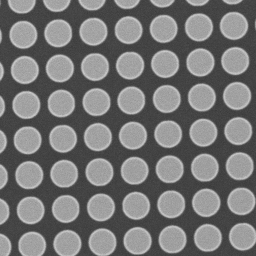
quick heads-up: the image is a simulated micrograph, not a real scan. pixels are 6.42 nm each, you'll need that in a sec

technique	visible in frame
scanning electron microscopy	an array of small figures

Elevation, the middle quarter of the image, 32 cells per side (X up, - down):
XX--XXXXXXX--XXXXXXX--XXXXXXX--X
XX--XXXXXXX--XXXXXXX--XXXXXX---X
XX---XXXXXX---XXXXX----XXXXX----
XX----XXXX-----XXX--------------
--------------------------------
------------------------XXX-----
------XXX------XXXX----XXXXX----
XX---XXXXXX---XXXXXX---XXXXXX--X
XX---XXXXXX--XXXXXXX--XXXXXXX--X
XXX--XXXXXX--XXXXXXX--XXXXXXX--X
XXX--XXXXXX---XXXXXX---XXXXXX---
XX---XXXXXX---XXXXX-----XXXX----
X------XXX----------------------
--------------------------------
-----------------X-------XX-----
X-----XXXXX----XXXXX---XXXXXX---
XX----XXXXX---XXXXXX---XXXXXX---
XXX--XXXXXXX--XXXXXXX--XXXXXX---
XXX--XXXXXXX--XXXXXXX--XXXXXX---
XXX--XXXXXXX--XXXXXX---XXXXXX---
XXX---XXXXX----XXXXX----XXXX----
XX------X-----------------------
--------------------------------
-----------------XX------XXX----
XX-----XXXX----XXXXX---XXXXXX---
XXX---XXXXXX---XXXXXX--XXXXXXX--
XXX---XXXXXX--XXXXXXX--XXXXXXX--
XXX---XXXXXX--XXXXXXX--XXXXXXX--
XXX---XXXXXX---XXXXX----XXXXX---
XXX----XXXX-----XXXX-----XXX----
X-------------------------------
--------------------------------